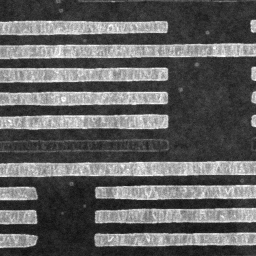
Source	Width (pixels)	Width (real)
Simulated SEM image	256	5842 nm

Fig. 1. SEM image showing wiring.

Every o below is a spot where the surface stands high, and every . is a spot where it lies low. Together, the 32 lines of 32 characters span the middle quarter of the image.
................................
oooooooooooooooooooooooooo......
oooooooooooooooooooooooooo......
oooooooooooooooooooooooooo......
................................
................................
................................
oooooooooooooooooooooooooo......
oooooooooooooooooooooooooo......
oooooooooooooooooooooooooo......
................................
................................
................................
oooooooooooooooooooooooooo......
oooooooooooooooooooooooooo......
oooooooooooooooooooooooooo......
................................
................................
................................
oooooooooooooooooooooooooo......
oooooooooooooooooooooooooo......
ooooooooooooooooooooooooo.......
................................
................................
................................
oooooooooooooooooooooooooooooooo
oooooooooooooooooooooooooooooooo
oooooooooooooooooooooooooooooooo
................................
................................
................................
........oooooooooooooooooooooooo